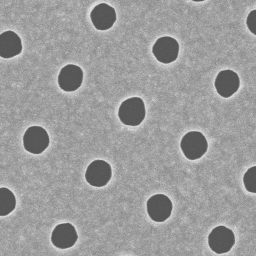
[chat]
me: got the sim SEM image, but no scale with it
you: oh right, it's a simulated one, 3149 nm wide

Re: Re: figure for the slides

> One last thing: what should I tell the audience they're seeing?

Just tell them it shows a regular array of holes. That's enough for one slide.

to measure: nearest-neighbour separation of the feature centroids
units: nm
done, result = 858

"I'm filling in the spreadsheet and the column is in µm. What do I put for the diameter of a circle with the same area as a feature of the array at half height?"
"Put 0.329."